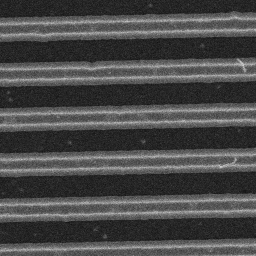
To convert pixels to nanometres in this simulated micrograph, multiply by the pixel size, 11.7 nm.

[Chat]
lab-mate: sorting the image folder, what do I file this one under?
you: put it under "parallel lines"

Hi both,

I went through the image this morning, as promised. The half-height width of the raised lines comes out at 0.199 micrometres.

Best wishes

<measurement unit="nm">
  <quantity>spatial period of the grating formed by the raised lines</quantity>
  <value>529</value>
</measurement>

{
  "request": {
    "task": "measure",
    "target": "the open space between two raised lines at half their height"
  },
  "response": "330 nm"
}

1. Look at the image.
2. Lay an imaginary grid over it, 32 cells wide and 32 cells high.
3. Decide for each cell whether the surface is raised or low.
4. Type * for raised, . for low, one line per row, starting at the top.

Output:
................................
................................
........************************
********************************
************....................
................................
................................
................................
********************************
********************************
................................
................................
................................
....................***..*******
********************************
***********************..*......
................................
................................
................................
......**.***********************
********************************
******.**.......................
................................
................................
................................
********************************
********************************
................................
................................
................................
.......................*********
********************************